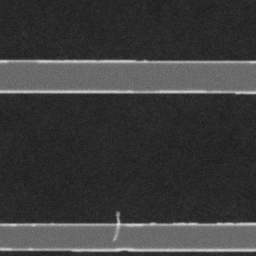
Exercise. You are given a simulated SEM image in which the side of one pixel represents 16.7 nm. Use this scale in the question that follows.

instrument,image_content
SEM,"lines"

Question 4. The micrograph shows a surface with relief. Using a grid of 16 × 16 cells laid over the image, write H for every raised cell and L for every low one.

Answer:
LLLLLLLLLLLLLLLL
LLLLLLLLLLLLLLLL
LLLLLLLLLLLLLLLL
LLLLLLLLLLLLLLLL
HHHHHHHHHHHHHHHH
HHHHHHHHHHHHHHHH
LLLLLLLLLLLLLLLL
LLLLLLLLLLLLLLLL
LLLLLLLLLLLLLLLL
LLLLLLLLLLLLLLLL
LLLLLLLLLLLLLLLL
LLLLLLLLLLLLLLLL
LLLLLLLLLLLLLLLL
LLLLLLLLLLLLLLLL
HHHHHHHHHHHHHHHH
HHHHHHHHHHHHHHHH